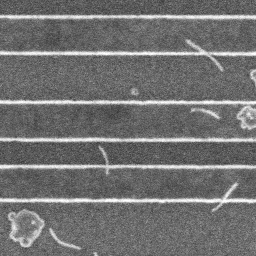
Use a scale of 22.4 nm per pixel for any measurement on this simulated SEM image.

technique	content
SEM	lines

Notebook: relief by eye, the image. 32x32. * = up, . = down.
................................
................................
********************************
********************************
********************************
********************************
********************************
................................
................................
................................
................................
................................
................................
********************************
********************************
********************************
********************************
..********...*******************
................................
................................
................................
********************************
********************************
********************************
********************************
................................
................................
................................
................................
................................
................................
................................